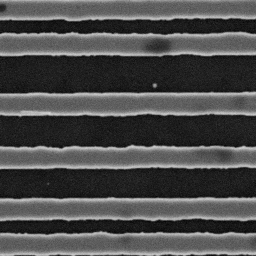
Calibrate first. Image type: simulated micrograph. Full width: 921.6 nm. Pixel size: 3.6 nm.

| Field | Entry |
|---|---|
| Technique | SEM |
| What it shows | lines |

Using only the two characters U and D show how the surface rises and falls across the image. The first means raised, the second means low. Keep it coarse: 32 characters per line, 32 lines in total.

UUUUUUUUUUUUUUUUUUUUUUUUUUUUUUUU
UUUUUUUUUUUUUUUUUUUUUUUUUUUUUUUU
DDDDDDDDUUDDDDDDDDDDDDDDDDDDDDDD
DDDDDDDDDDDDDDDDDDDDDDDDDDDDDDDD
UUUUUUUUUUUUUUUUUUUUUUUUUUUUUUUU
UUUUUUUUUUUUUUUUUUUUUUUUUUUUUUUU
UUUUUUUUUUUUUUUUUUUUUUUUUUUUUUUU
DDDDDDDDDDDDDDDDDDDDDDDDDDDDDDDD
DDDDDDDDDDDDDDDDDDDDDDDDDDDDDDDD
DDDDDDDDDDDDDDDDDDDDDDDDDDDDDDDD
DDDDDDDDDDDDDDDDDDDDDDDDDDDDDDDD
DDDDDDDDDDDDDDDDDDDDDDDDDDDDDDDD
UUUUUUUUUUUUUUUUUUUUUUUUUUUUUUUU
UUUUUUUUUUUUUUUUUUUUUUUUUUUUUUUU
DDUDDDDDDDDDUDDUDDDDDDDDDDDDDDDD
DDDDDDDDDDDDDDDDDDDDDDDDDDDDDDDD
DDDDDDDDDDDDDDDDDDDDDDDDDDDDDDDD
DDDDDDDDDDDDDDDDDDDDDDDDDDDDDDDD
UUUUUUUDUUUUUUUUUUUUUUUUUUUUUUUU
UUUUUUUUUUUUUUUUUUUUUUUUUUUUUUUU
UUUUUUUUUUUUUUUUUUUUUUUUUUUUUUUU
DDDDDDDDDDDDDDDDDDDDDDDDDDDDDDDD
DDDDDDDDDDDDDDDDDDDDDDDDDDDDDDDD
DDDDDDDDDDDDDDDDDDDDDDDDDDDDDDDD
DDDDDDDDDDDDDDDDDDDDDDDDDDDDDDDD
UUUUUUUUUUUUUUUUUUUUUUUUUUUUUUUU
UUUUUUUUUUUUUUUUUUUUUUUUUUUUUUUU
UDDDDDDDUDDDDDDDDDDUDDDDDDDDDDUD
DDDDDDDDDDDDDDDDDDDDDDDDDDDDDDDD
UUUUUUUUUUUUUUUUUUUUUUUUUUUUUUUU
UUUUUUUUUUUUUUUUUUUUUUUUUUUUUUUU
UUUUUUUUUUUUUUUUUUUUUUUUUUUUUUUU